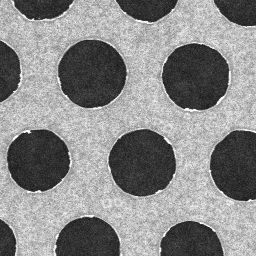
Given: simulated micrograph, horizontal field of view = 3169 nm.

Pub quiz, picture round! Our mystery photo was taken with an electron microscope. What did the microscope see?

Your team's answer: holes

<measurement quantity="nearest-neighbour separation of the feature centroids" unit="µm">1.26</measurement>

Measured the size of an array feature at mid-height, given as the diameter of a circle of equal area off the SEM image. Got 67.1 px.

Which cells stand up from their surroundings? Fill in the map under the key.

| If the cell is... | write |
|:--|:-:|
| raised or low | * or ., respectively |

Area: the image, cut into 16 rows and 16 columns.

*...****...***..
***************.
*****.**********
.***....***...**
.***....**....**
.***....**....**
*****..****..***
****************
*...****..****..
....***....**...
*...***....**...
*...***...***...
***************.
****************
.***...***...***
.**....***....**